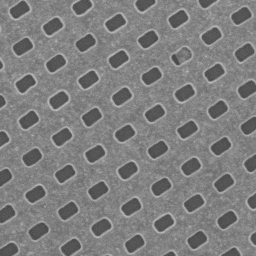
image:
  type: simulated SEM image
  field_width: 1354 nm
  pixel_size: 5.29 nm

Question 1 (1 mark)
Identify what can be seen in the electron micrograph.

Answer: a regular array of holes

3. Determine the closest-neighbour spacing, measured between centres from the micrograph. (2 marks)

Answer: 0.191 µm